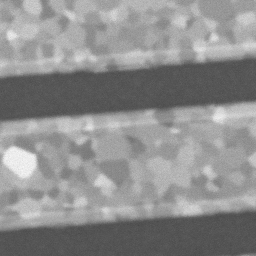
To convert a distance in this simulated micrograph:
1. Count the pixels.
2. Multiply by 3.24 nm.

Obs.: one or a few lines or trenches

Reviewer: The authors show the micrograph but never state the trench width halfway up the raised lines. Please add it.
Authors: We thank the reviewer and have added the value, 60.3 pixels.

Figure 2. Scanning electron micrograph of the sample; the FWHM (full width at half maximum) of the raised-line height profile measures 92 pixels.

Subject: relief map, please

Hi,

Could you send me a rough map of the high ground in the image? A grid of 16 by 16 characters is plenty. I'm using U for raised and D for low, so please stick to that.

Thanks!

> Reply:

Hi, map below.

UUUUUUUUUUUUUUUU
UUUUUUUUUUUUUUUU
UUUUUUUUUUUUUUUU
UUUUUUUUUUDDDDDD
DDDDDDDDDDDDDDDD
DDDDDDDDDDDDDDDD
DDDDDDDDDDDDDDDD
DDDDDDDDUUUUUUUU
UUUUUUUUUUUUUUUU
UUUUUUUUUUUUUUUU
UUUUUUUUUUUUUUUU
UUUUUUUUUUUUUUUU
UUUUUUUUUUUUUUUU
UUUUUDDDDDDDDDDD
DDDDDDDDDDDDDDDD
DDDDDDDDDDDDDDDD